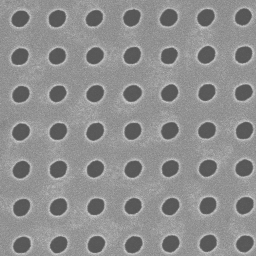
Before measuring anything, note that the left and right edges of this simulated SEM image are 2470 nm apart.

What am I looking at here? a regular array of holes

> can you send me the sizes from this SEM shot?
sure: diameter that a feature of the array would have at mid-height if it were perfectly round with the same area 170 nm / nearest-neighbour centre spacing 357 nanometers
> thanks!